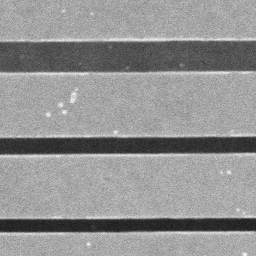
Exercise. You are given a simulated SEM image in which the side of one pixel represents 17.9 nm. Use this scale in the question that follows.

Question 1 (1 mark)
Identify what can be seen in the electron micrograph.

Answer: lines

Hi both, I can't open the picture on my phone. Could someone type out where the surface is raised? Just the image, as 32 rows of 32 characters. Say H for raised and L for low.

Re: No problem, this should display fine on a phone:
HHHHHHHHHHHHHHHHHHHHHHHHHHHHHHHH
HHHHHHHHHHHHHHHHHHHHHHHHHHHHHHHH
HHHHHHHHHHHHHHHHHHHHHHHHHHHHHHHH
HHHHHHHHHHHHHHHHHHHHHHHHHHHHHHHH
HHHHHHHHHHHHHHHHHHHHHHHHHHHHHHHH
LLLLLLLLLLLLLLLLLLLLLLLLLLLLLLLL
LLLLLLLLLLLLLLLLLLLLLLLLLLLLLLLL
LLLLLLLLLLLLLLLLLLLLLLLLLLLLLLLL
LLLLLLLLLLLLLLLLLLLLLLLLLLLLLLLL
HHHHHHHHHHHHHHHHHHHHHHHHHHHHHHHH
HHHHHHHHHHHHHHHHHHHHHHHHHHHHHHHH
HHHHHHHHHHHHHHHHHHHHHHHHHHHHHHHH
HHHHHHHHHHHHHHHHHHHHHHHHHHHHHHHH
HHHHHHHHHHHHHHHHHHHHHHHHHHHHHHHH
HHHHHHHHHHHHHHHHHHHHHHHHHHHHHHHH
HHHHHHHHHHHHHHHHHHHHHHHHHHHHHHHH
HHHHHHHHHHHHHHHHHHHHHHHHHHHHHHHH
LLLLLLLLLLLLLLLLLLLLLLLLLLLLLLLL
LLLLLLLLLLLLLLLLLLLLLLLLLLLLLLLL
HHHHHHHHHHHHHHHHHHHHHHHHHHHHHHHH
HHHHHHHHHHHHHHHHHHHHHHHHHHHHHHHH
HHHHHHHHHHHHHHHHHHHHHHHHHHHHHHHH
HHHHHHHHHHHHHHHHHHHHHHHHHHHHHHHH
HHHHHHHHHHHHHHHHHHHHHHHHHHHHHHHH
HHHHHHHHHHHHHHHHHHHHHHHHHHHHHHHH
HHHHHHHHHHHHHHHHHHHHHHHHHHHHHHHH
HHHHHHHHHHHHHHHHHHHHHHHHHHHHHHHH
LLLLLLLLLLLLLLLLLLLLLLLLLLLLLLLL
LLLLLLLLLLLLLLLLLLLLLLLLLLLLLLLL
HHHHHHHHHHHHHHHHHHHHHHHHHHHHHHHH
HHHHHHHHHHHHHHHHHHHHHHHHHHHHHHHH
HHHHHHHHHHHHHHHHHHHHHHHHHHHHHHHH